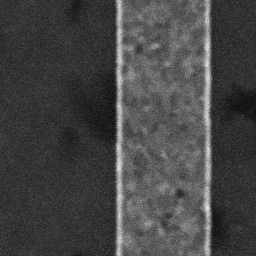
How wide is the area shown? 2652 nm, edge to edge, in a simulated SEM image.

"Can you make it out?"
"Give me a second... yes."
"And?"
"one or a few lines or trenches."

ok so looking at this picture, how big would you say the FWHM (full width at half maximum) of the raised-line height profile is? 920 nanometres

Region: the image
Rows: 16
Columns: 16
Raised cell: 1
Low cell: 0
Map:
0000000111111000
0000000111111000
0000000111111000
0000000111111000
0000000111111000
0000000111111000
0000000111111000
0000000111111000
0000000111111000
0000000111111000
0000000111111000
0000000111111000
0000000111111000
0000000111111000
0000000111111000
0000000111111000